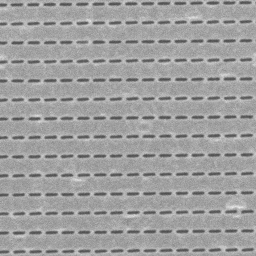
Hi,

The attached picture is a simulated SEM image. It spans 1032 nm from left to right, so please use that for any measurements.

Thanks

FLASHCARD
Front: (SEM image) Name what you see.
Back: a regular array of holes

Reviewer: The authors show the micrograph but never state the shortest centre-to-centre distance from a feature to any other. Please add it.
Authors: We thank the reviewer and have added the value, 64.9 nm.